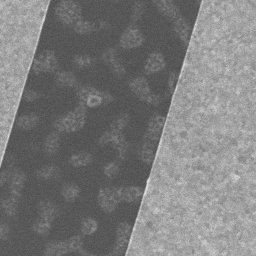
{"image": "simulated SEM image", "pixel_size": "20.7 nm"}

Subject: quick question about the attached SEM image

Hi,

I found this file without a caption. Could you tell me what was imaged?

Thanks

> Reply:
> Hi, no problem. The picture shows one or a few lines or trenches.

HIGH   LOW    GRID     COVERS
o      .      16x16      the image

ooo..........ooo
ooo.........oooo
oo..........oooo
oo..........oooo
oo.........ooooo
o..........ooooo
o..........ooooo
o.........oooooo
o.........oooooo
..........oooooo
..........oooooo
.........ooooooo
.........ooooooo
.........ooooooo
........oooooooo
........oooooooo